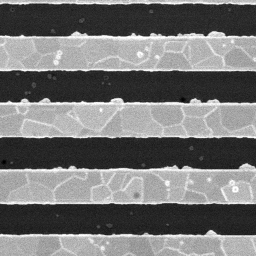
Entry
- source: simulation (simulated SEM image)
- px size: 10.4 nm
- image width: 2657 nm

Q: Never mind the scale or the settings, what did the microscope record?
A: lines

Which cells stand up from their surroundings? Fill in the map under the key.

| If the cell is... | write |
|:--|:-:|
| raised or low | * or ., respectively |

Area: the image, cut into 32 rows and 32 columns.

................................
................................
................................
................................
.........*................**....
********************************
********************************
********************************
********************************
................................
................................
................................
..............*.................
********************************
********************************
********************************
********************************
................................
................................
................................
................................
********************************
********************************
********************************
********************************
................................
................................
................................
................................
*..********....*......*..***....
********************************
********************************